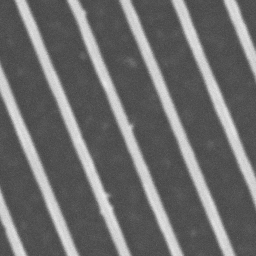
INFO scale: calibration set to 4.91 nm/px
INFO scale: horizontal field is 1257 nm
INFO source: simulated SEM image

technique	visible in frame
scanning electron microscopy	parallel lines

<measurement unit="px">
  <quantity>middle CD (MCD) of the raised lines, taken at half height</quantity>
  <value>8.92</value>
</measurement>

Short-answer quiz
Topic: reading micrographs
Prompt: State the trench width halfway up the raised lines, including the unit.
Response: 192 nm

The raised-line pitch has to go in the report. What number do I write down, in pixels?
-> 48.3